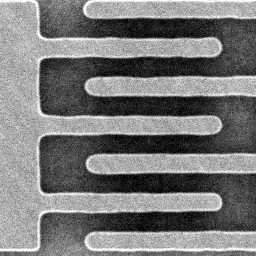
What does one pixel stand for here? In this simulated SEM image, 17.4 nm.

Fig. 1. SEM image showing groups of lines, slits or small figures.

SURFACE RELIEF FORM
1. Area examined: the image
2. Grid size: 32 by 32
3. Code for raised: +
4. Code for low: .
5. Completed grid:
+++++......+++++++++++++++++++++
+++++......+++++++++++++++++++++
+++++...........................
+++++...........................
+++++...........................
++++++++++++++++++++++++++++....
+++++++++++++++++++++++++++.....
+++++...........................
+++++...........................
+++++...........................
+++++......+++++++++++++++++++++
+++++......+++++++++++++++++++++
+++++...........................
+++++...........................
++++++..........................
++++++++++++++++++++++++++++....
+++++++++++++++++++++++++++.....
+++++...........................
+++++...........................
+++++.......++++++++++++++++++++
+++++......+++++++++++++++++++++
+++++.......++++++++.+++.+++.+++
+++++...........................
+++++...........................
+++++++++++++++++++++++++++.....
++++++++++++++++++++++++++++....
++++++....++++..................
+++++...........................
+++++...........................
+++++......+++++++++++++++++++++
+++++......+++++++++++++++++++++
................................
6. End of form